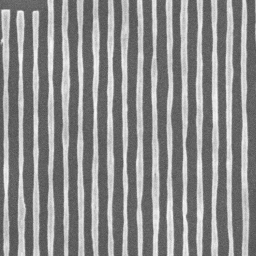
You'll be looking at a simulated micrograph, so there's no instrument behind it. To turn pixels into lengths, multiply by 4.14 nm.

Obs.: parallel lines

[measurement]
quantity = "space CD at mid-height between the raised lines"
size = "43.5 nanometers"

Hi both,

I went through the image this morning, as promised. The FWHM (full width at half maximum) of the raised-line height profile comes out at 18.1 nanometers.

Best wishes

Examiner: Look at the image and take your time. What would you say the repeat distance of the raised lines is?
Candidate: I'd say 61.8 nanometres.